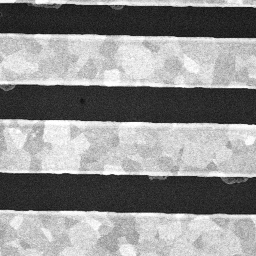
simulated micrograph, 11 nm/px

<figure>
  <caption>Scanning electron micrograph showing lines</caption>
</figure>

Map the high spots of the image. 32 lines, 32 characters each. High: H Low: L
LLLLLLLLLHHHHHHHHHHHHHHHHHHHHHHH
LLLLLLLLLLLLLLLLLLLLLLLLLLLLLLLL
LLLLLLLLLLLLLLLLLLLLLLLLLLLLLLLL
LLLLLLLLLLLLLLLLLLLLLLLLLLLLLLLL
HHHHHHHHHHHHHHHHLLLLLLLLLLLLLLLL
HHHHHHHHHHHHHHHHHHHHHHHHHHHHHHHH
HHHHHHHHHHHHHHHHHHHHHHHHHHHHHHHH
HHHHHHHHHHHHHHHHHHHHHHHHHHHHHHHH
HHHHHHHHHHHHHHHHHHHHHHHHHHHHHHHH
HHHHHHHHHHHHHHHHHHHHHHHHHHHHHHHH
LLLLLHHLHHHHHHHHHHHHHHHHHHHHHHHH
LLLLLLLLLLLLLLLLLLLLLLLLLLLLLLLL
LLLLLLLLLLLLLLLLLLLLLLLLLLLLLLLL
LLLLLLLLLLLLLLLLLLLLLLLLLLLLLLLL
LLLLLLLLLLLLLLLLLLLLLLLLLLLLLLLL
HHHHHHHHHHHHHHHHHHHHHHHLHHHLLLLL
HHHHHHHHHHHHHHHHHHHHHHHHHHHHHHHH
HHHHHHHHHHHHHHHHHHHHHHHHHHHHHHHH
HHHHHHHHHHHHHHHHHHHHHHHHHHHHHHHH
HHHHHHHHHHHHHHHHHHHHHHHHHHHHHHHH
HHHHHHHHHHHHHHHHHHHHHHHHHHHHHHHH
LHHHHHHHHHHHHHHHHHHHHHHHHHHHHHHH
LLLLLLLLLLLLLLLLLLLLLLLLLLLLLLLL
LLLLLLLLLLLLLLLLLLLLLLLLLLLLLLLL
LLLLLLLLLLLLLLLLLLLLLLLLLLLLLLLL
LLLLLLLLLLLLLLLLLLLLLLLLLLLLLLLL
HHHHHHHHHHLLLLLLLLLLLLLLLLLLLLLL
HHHHHHHHHHHHHHHHHHHHHHHHHHHHHHHH
HHHHHHHHHHHHHHHHHHHHHHHHHHHHHHHH
HHHHHHHHHHHHHHHHHHHHHHHHHHHHHHHH
HHHHHHHHHHHHHHHHHHHHHHHHHHHHHHHH
HHHHHHHHHHHHHHHHHHHHHHHHHHHHHHHH